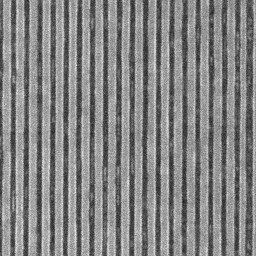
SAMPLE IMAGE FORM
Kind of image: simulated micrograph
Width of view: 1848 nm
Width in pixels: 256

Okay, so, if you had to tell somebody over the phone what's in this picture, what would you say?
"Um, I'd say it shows parallel lines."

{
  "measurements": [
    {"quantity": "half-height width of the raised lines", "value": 47.8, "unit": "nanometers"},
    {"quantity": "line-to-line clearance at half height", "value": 47.8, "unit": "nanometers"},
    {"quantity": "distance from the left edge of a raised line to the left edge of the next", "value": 0.0949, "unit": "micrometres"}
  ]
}